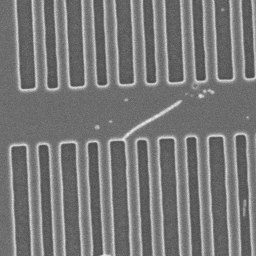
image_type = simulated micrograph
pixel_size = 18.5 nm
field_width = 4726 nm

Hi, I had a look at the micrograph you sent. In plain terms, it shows groups of lines, slits or small figures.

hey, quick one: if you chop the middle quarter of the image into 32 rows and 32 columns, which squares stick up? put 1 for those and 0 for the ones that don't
10000111000110000111000111000011
10000111000110000111000111000011
10000111000110000011000111000011
10000111000110000011000111000011
10000111000111000011100111000111
11000111111111111111111111111111
11111111111111111111111111111111
11111111111111111111111111111111
11111111111111111111111111111111
11111111111111111111111111111111
11111111111111111111111111111111
11111111111111111111111111111111
11111111111111111111111111111111
11111111111111111111111111111111
11111111111111111111111111111111
11111111111111111111111111111111
11111111111111111111111111111111
11111111111111111111111111111111
11111111111111111111111111011110
11111110111100011100011100001110
00011100011000011100011100001110
00011100011000011100011100001110
00011100011000011100011100001110
00011100011000001100011100001110
00011100011000001100011100001110
00011100011000001100011100001110
00011100011100001100011100001110
00001100011100001100011100001110
00001100011100001110011100001110
00001100011100001110011100001110
00001100011100001110011100001110
00001100011100001110001100001110